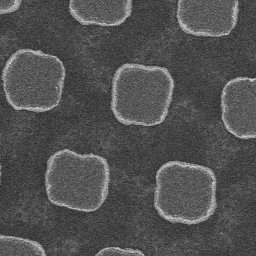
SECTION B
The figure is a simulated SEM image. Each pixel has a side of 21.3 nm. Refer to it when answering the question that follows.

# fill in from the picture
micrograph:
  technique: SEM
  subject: raised bodies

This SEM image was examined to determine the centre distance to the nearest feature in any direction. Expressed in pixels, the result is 107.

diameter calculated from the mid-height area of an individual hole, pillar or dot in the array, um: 1.33